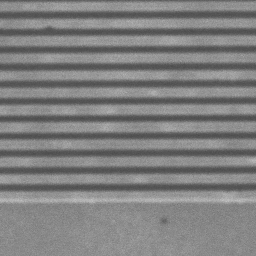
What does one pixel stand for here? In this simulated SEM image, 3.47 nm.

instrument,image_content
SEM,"parallel lines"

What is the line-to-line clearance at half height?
0.023 micrometres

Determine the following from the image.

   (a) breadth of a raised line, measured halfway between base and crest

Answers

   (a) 10.4 pixels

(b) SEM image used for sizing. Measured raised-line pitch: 59.9 nm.